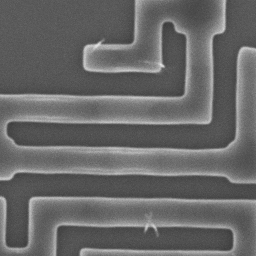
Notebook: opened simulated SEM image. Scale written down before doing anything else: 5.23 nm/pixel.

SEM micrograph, wiring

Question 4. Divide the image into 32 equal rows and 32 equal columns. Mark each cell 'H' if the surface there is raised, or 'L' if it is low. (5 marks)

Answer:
LLLLLLLLLLLLLLLLLHHHHHHHHHHHLLLL
LLLLLLLLLLLLLLLLLHHHHHHHHHHHLLLL
LLLLLLLLLLLLLLLLLHHHHHHHHHHHLLLL
LLLLLLLLLLLLLLLLLHHHLLHHHHHHLLLL
LLLLLLLLLLLLLLLLLHHHLLLHHHHLLLLL
LLLLLLLLLLLLLLLLHHHHLLLHHHLLLLLL
LLLLLLLLLLLHHHHHHHHHLLLHHHLLLLHH
LLLLLLLLLLLHHHHHHHHHLLLHHHHLLLHH
LLLLLLLLLLLHHHHHHHHHLLLHHHHLLLHH
LLLLLLLLLLLLLLLLLLLLLLLHHHHLLLHH
LLLLLLLLLLLLLLLLLLLLLLLHHHHLLLHH
LLLLLLLLLLLLLLLLLLLLLLLHHHHLLLHH
HHHHHHHHHHHHHHHHHHHHHHHHHHLLLLHH
HHHHHHHHHHHHHHHHHHHHHHHHHHLLLLHH
HHHHHHHHHHHHHHHHHHHHHHHHHHLLLLHH
HLLLLLLLLLLLLLLLLLLLLLLLLLLLLLHH
HLLLLLLLLLLLLLLLLLLLLLLLLLLLLLHH
HLLLLLLLLLLLLLLLLLLLLLLLLLLLLHHH
HHHHHHHHHHHHHHHHLLLLLLLLLLLLHHHH
HHHHHHHHHHHHHHHHHHHHHHHHHHHHHHHH
HHHHHHHHHHHHHHHHHHHHHHHHHHHHHHHH
HHLLHHHHHHHHHHHHHHHHHHHHHHHHHHHH
LLLLLLLLLLLLLLLLLLLLLLLLLLLLLHHH
LLLLLLLLLLLLLLLLLLLLLLLLLLLLLLLL
LLLLLLLLLLLLLLLLLLLLLLLLLLLLLLLL
HLLLHHHHHHHHHHHHHHHHHHHHHHHHHHHH
HLLLHHHHHHHHHHHHHHHHHHHHHHHHHHHH
HLLLHHHHHHHHHHHHHHHHHHHHHHHHHHHH
HLLLHHHLLLLLLLLLLLLLLLLLLLLLHHHH
HLLLHHHLLLLLLLLLLLLLLLLLLLLLLHHH
HLLHHHHLLLLLLLLLLLLLLLLLLLLLLHHH
HHHHHHHLLLHHHHHHHHHHHHHHHHHHHHHH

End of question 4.